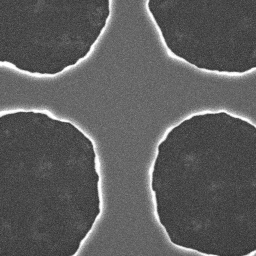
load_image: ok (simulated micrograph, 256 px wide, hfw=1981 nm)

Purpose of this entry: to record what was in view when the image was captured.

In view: holes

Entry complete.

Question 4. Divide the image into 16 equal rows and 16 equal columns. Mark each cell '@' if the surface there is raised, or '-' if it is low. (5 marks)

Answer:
-------@@-------
-------@@@------
------@@@@------
-----@@@@@@-----
@@--@@@@@@@@@@-@
@@@@@@@@@@@@@@@@
@@@@@@@@@@@@@@@@
----@@@@@@@@---@
-----@@@@@------
------@@@@------
------@@@@------
------@@@-------
------@@@@------
------@@@@------
------@@@@------
-----@@@@@@@----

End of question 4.